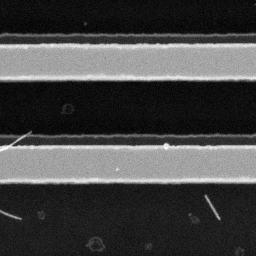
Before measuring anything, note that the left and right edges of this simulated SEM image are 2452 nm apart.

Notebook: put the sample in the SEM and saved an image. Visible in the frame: lines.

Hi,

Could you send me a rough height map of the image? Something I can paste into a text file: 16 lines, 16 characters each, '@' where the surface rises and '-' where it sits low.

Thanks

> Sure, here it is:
----------------
----------------
@@@@@@@@@@@@@@@@
@@@@@@@@@@@@@@@@
@@@@@@@@@@@@@@@@
----------------
----------------
----------------
-------------@--
@@@@@@@@@@@@@@@@
@@@@@@@@@@@@@@@@
----------------
----------------
----------------
----------------
----------------